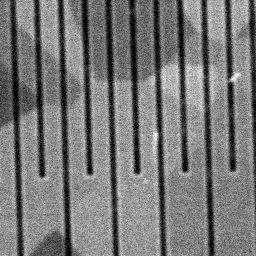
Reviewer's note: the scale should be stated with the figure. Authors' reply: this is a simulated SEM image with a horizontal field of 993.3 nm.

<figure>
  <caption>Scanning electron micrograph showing parallel lines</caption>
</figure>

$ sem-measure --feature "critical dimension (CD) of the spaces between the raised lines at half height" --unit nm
26.6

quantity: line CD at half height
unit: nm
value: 65.8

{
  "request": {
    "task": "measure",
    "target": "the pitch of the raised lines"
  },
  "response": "92.5 nanometers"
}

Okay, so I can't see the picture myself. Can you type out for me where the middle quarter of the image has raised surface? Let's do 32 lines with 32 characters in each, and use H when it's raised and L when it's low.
LHHHHLLHHHHLLHHHHLHHHHLLHHHHLLHH
LHHHHLLHHHHLLHHHHLHHHHHLHHHHLLHH
LHHHHLLHHHHLLHHHHLLHHHHLHHHHHLHH
LHHHHLLHHHHLLHHHHLLHHHHLLHHHHLHH
LHHHHLLHHHHLLHHHHLLHHHHLLHHHHLLH
LHHHHLLHHHHLLHHHHLLHHHHLLHHHHLLH
LHHHHLLHHHHLLHHHHLLHHHHLLHHHHLLH
LHHHHLLHHHHLLHHHHLLHHHHLLHHHHLLH
LHHHHLLHHHHLLHHHHLLHHHHLLHHHHLLH
LHHHHLLHHHHLLHHHHLLHHHHLLHHHHLLH
LHHHHLLHHHHLLHHHHLLHHHHLLHHHHLLH
LHHHHLLHHHHLLHHHHLLHHHHLLHHHHLLH
LHHHHLLHHHHLLHHHHLLHHHHLLHHHHLLH
LHHHHLLHHHHLLHHHHLLHHHHLLHHHHLLH
LHHHHLLHHHHLLHHHHLLHHHHLLHHHHLLH
LHHHHLLHHHHLLHHHHLLHHHHLLHHHHLLH
LHHHHLLHHHHLLHHHHLLHHHHLLHHHHLLH
LHHHHLLHHHHLLHHHHLLHHHHLLHHHHLLH
LHHHHLLHHHHLLHHHHLLHHHHLLHHHHLLH
LHHHHLLHHHHLLHHHHLLHHHHLLHHHHLLH
LHHHHLLHHHHLLHHHHLLHHHHLLHHHHLLH
LHHHHLLHHHHLLHHHHLLHHHHLLHHHHLLH
LHHHHLLHHHHLLHHHHLLHHHHLLHHHHLLH
LHHHHLLHHHHLLHHHHLLHHHHLLHHHHLLH
LHHHHLLHHHHLLHHHHLLHHHHLLHHHHLLH
LHHHHLLHHHHLLHHHHLLHHHHLLHHHHLLH
LHHHHLLHHHHLLHHHHLLHHHHLLHHHHLLH
LHHHHLLHHHHLLHHHHHLHHHHLLHHHHHHH
LHHHHHHHHHHLLHHHHHHHHHHLLHHHHHHH
LHHHHHHHHHHLLHHHHHHHHHHLLHHHHHHH
LLHHHHHHHHHLLHHHHHHHHHHLLHHHHHHH
LLHHHHHHHHHHLHHHHHHHHHHLLHHHHHHH